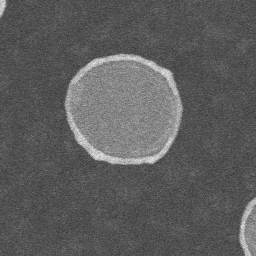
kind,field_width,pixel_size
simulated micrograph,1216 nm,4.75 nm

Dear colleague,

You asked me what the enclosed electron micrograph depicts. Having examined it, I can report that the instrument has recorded raised bodies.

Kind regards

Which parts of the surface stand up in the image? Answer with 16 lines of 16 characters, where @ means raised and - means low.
----------------
----------------
----------------
-------@@-------
-----@@@@@@-----
----@@@@@@@-----
----@@@@@@@-----
----@@@@@@@-----
-----@@@@@@-----
-----@@@@@------
----------------
----------------
----------------
---------------@
---------------@
---------------@